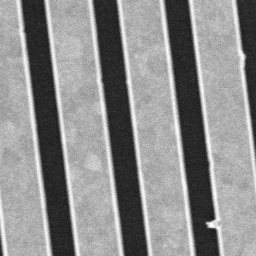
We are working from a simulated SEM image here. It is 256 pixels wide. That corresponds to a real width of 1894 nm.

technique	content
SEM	one or a few lines or trenches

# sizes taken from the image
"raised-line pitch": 530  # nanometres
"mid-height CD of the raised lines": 0.314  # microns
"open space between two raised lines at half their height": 219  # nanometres